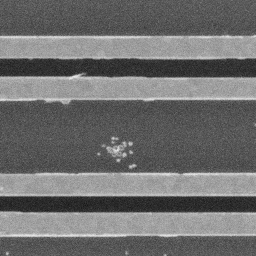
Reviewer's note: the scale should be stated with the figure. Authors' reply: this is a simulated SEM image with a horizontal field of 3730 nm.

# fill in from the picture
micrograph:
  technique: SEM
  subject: lines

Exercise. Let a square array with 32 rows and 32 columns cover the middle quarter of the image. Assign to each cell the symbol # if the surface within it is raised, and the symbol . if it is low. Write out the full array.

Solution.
................................
................................
................................
####.######...#####.............
################################
################################
################################
################################
################################
................................
................................
................................
................................
................................
................................
................................
................................
................................
................................
................................
................................
................................
................................
................................
................................
................................
................................
#..#########################..##
################################
################################
################################
################################